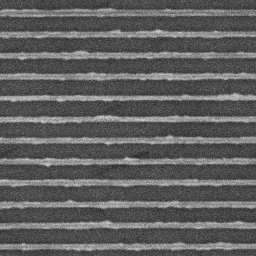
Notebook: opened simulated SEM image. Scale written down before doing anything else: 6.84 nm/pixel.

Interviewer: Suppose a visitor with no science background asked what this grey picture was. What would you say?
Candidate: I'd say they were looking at parallel lines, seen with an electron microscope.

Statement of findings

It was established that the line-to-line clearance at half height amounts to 110 nm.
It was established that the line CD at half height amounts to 5.88 px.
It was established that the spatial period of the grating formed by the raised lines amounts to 21.3 pixels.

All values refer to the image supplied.